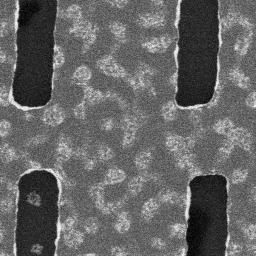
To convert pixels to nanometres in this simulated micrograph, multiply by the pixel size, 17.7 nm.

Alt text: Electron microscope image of holes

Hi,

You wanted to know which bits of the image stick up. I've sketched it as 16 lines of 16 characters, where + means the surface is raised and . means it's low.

+...+++++++...++
+..++++++++...++
+..++++++++...++
+..++++++++...++
+..++++++++...++
+..++++++++..+++
+..++++++++..+++
++++++++++++++++
++++++++++++++++
++++++++++++++++
++++++++++++++++
+...++++++++..++
+...++++++++..++
+...++++++++..++
+...++++++++..++
+...++++++++..++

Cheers